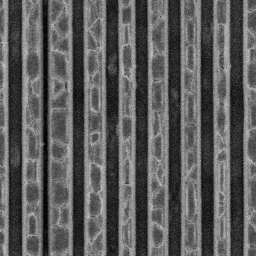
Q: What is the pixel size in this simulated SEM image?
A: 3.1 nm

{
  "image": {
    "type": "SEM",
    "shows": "parallel lines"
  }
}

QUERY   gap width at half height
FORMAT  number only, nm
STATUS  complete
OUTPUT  48.8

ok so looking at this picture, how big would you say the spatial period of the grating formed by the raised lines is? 97.5 nm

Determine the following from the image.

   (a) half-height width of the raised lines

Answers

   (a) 51.9 nm